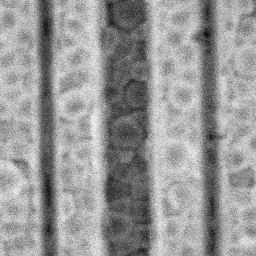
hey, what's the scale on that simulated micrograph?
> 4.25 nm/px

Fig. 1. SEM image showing one or a few lines or trenches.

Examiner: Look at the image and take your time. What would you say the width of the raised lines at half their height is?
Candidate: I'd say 182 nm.